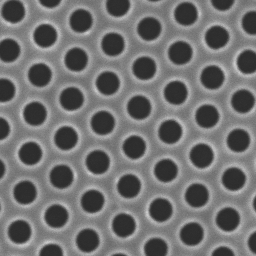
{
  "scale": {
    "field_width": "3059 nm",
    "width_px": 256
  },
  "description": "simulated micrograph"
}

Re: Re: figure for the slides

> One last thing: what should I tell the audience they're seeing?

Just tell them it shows a regular array of holes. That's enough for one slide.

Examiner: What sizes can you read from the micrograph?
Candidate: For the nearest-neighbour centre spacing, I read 467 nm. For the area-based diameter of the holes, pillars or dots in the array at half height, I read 293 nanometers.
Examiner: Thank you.